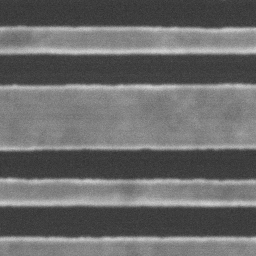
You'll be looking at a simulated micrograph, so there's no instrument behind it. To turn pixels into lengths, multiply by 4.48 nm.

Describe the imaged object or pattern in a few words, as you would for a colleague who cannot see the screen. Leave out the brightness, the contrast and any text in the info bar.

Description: lines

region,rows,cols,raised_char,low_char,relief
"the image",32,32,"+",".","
................................
................................
................................
+++++++++++++++++++++++.........
++++++++++++++++++++++++++++++++
++++++++++++++++++++++++++++++++
+......++++++++++..+............
................................
................................
................................
................................
++++++++++++++++++++++++++++++++
++++++++++++++++++++++++++++++++
++++++++++++++++++++++++++++++++
++++++++++++++++++++++++++++++++
++++++++++++++++++++++++++++++++
++++++++++++++++++++++++++++++++
++++++++++++++++++++++++++++++++
++++++++++++++++++.+++++++++....
................................
................................
................................
+++++++++++++..+.++++++.++......
++++++++++++++++++++++++++++++++
++++++++++++++++++++++++++++++++
+++++++++...........++++++++++++
................................
................................
................................
................................
++++++++++++++++++++++++++++++++
++++++++++++++++++++++++++++++++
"